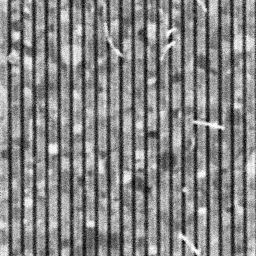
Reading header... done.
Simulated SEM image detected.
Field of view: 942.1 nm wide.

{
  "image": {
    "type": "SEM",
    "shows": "parallel lines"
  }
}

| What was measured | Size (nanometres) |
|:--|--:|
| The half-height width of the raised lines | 27.6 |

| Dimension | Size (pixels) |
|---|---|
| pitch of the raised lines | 12.4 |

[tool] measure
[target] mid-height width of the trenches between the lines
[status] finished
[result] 0.0175 microns